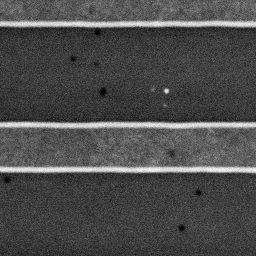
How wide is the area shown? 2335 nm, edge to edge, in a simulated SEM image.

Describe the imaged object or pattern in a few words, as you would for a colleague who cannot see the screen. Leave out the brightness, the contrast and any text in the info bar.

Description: wiring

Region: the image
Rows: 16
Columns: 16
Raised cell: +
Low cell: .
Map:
++++++++++++++++
.....+++......++
................
................
................
................
................
................
++++++++++++++++
++++++++++++++++
++++++++++++++++
................
................
................
................
................